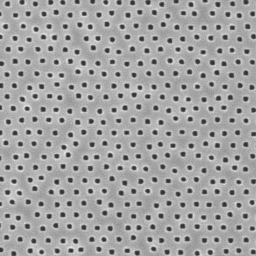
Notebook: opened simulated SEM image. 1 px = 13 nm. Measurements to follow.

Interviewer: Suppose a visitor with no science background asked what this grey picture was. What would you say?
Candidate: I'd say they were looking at a regular array of holes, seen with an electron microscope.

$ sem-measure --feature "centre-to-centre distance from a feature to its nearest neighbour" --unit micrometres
0.154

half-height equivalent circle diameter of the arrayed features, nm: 74.8